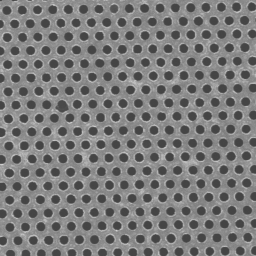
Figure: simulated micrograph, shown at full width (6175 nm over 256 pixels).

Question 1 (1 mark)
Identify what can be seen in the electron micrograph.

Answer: a regular array of holes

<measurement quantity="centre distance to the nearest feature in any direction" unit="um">0.365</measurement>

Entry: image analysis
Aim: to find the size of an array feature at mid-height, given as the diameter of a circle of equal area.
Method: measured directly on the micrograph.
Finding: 223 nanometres